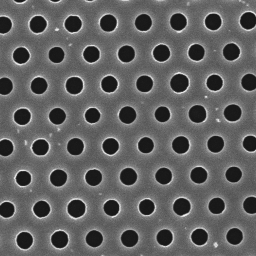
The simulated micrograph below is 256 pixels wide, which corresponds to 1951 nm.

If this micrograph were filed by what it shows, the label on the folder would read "a regular array of holes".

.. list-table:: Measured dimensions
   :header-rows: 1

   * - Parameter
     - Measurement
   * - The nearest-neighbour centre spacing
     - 266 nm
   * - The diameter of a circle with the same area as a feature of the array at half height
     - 127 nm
